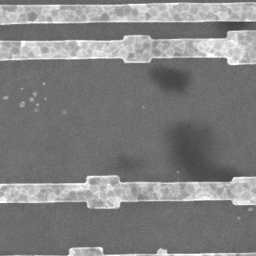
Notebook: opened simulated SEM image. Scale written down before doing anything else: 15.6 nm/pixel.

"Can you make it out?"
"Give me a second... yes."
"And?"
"wiring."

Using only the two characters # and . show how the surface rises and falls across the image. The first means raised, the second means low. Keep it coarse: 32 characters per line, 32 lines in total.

..................##############
################################
################################
................................
................##..........####
################################
################################
#..............####.........####
................................
................................
................................
................................
................................
................................
................................
................................
................................
................................
................................
................................
................................
................................
...........####..............###
################################
################################
...........####..............###
................................
................................
................................
................................
................................
.........####...................